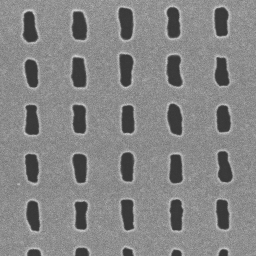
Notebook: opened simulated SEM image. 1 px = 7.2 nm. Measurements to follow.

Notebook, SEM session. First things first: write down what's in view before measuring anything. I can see a regular array of holes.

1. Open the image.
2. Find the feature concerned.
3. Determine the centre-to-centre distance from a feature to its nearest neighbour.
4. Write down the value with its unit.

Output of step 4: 337 nm